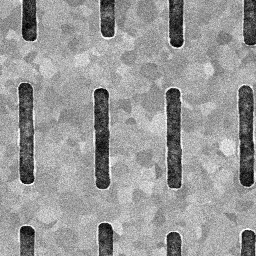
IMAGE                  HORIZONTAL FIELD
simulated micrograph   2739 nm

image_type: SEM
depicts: holes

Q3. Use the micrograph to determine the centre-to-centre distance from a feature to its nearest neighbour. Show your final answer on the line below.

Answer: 773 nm